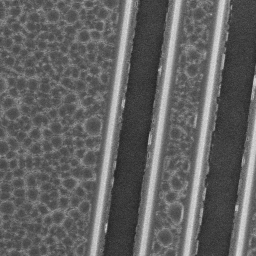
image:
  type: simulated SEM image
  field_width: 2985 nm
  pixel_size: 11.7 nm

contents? one or a few lines or trenches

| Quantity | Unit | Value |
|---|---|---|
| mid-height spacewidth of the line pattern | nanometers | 574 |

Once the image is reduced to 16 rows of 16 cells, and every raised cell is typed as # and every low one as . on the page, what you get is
########...###..
########...###..
########...###..
########...##...
#######....##...
#######...###...
#######...###...
#######...###...
#######...###...
#######...###...
#######...##....
######....##....
######...###...#
######...###...#
######...###...#
######...###...#